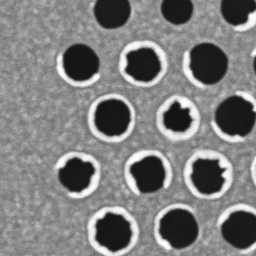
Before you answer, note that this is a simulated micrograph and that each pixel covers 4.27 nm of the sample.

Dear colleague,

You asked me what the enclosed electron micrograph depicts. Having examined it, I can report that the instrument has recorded a regular array of holes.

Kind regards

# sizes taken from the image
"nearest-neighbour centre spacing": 264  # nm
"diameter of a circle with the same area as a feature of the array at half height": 36.3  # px